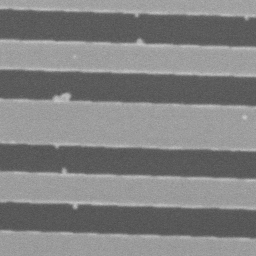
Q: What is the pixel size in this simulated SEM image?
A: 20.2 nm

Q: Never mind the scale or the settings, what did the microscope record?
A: lines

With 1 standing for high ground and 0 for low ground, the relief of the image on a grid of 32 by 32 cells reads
11111111111111111111111111111111
00000000000000011111111111111111
00000000000000000000000000000000
00000000000000000000000000000000
00000000000000000000000000000000
11111111111111111000000000000000
11111111111111111111111111111111
11111111111111111111111111111111
11111111111111111111111111111111
00000000000000000000000000000011
00000000000000000000000000000000
00000000000000000000000000000000
11110000000000000000000000000000
11111111111111111111111111111111
11111111111111111111111111111111
11111111111111111111111111111111
11111111111111111111111111111111
11111111111111111111111111111111
00000000000000000000111111111111
00000000000000000000000000000000
00000000000000000000000000000000
00000000000000000000000000000000
11111111111111111111111111111111
11111111111111111111111111111111
11111111111111111111111111111111
00000000000011111111111111111111
00000000000000000000000000000000
00000000000000000000000000000000
00000000000000000000000000000000
11111111111111111111000000000000
11111111111111111111111111111111
11111111111111111111111111111111